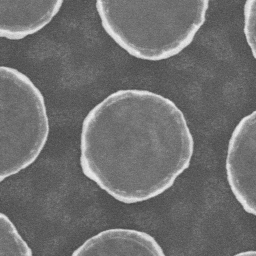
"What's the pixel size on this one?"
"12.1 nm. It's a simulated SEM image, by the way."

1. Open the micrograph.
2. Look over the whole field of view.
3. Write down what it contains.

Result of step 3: raised bodies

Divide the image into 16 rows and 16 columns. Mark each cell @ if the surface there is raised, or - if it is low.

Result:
@@@@--@@@@@@@--@
@@@----@@@@@@--@
-------@@@@@---@
---------@------
@---------------
@@--------------
@@@---@@@@@-----
@@@--@@@@@@@---@
@@@--@@@@@@@---@
@@---@@@@@@@--@@
@----@@@@@@---@@
------@@@@@---@@
--------@------@
----------------
@-----@@@-------
@@---@@@@@------